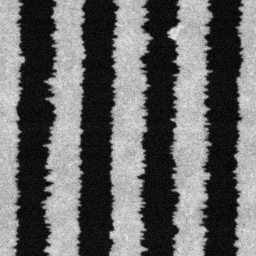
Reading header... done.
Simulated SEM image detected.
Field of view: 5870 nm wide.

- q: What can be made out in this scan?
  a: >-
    one or a few lines or trenches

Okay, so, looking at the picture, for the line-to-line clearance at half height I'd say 756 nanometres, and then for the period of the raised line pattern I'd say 1430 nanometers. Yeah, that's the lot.